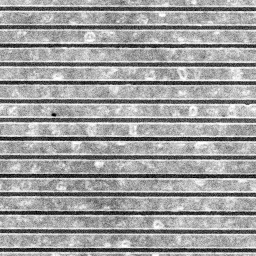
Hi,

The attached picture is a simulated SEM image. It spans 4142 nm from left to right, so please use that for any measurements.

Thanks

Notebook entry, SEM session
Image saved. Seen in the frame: parallel lines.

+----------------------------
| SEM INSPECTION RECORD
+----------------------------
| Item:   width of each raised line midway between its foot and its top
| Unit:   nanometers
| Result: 220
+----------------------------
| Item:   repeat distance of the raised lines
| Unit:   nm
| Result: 300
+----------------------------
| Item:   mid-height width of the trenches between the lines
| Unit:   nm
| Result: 72.8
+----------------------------